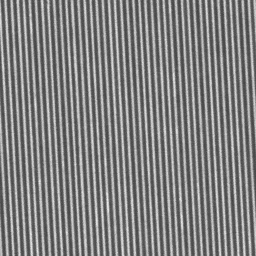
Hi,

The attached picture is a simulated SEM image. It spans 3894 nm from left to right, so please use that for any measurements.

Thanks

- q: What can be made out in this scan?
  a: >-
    parallel lines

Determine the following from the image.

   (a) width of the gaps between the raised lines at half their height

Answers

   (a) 55.1 nanometers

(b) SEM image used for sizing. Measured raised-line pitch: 92.4 nm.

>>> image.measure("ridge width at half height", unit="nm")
28.5